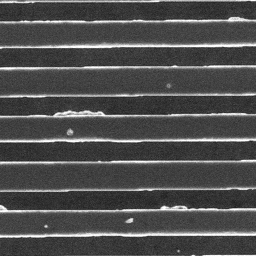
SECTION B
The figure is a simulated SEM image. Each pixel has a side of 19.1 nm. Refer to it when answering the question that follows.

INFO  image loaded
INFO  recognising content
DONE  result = lines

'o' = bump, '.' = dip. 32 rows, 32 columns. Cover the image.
................................
................................
................................
oooooooooooooooooooooooooooooooo
oooooooooooooooooooooooooooooooo
oooooooooooooooooooooooooooooooo
................................
................................
..........oooooooooooooooooooooo
oooooooooooooooooooooooooooooooo
oooooooooooooooooooooooooooooooo
oooooooooooooooooooooooooooooooo
................................
................................
....oo..oooooooooooooooooooooooo
oooooooooooooooooooooooooooooooo
oooooooooooooooooooooooooooooooo
ooooooooooooooooooooooooooooo...
................................
................................
oooooooooooooooooooooooooooooooo
oooooooooooooooooooooooooooooooo
oooooooooooooooooooooooooooooooo
oooooooooooooooooooooooooooooooo
................................
................................
oooooooooooooooooooooooooooooooo
oooooooooooooooooooooooooooooooo
oooooooooooooooooooooooooooooooo
oo..............................
................................
................................